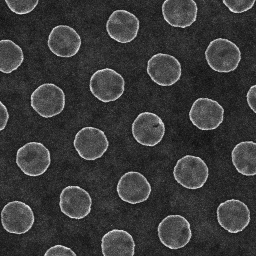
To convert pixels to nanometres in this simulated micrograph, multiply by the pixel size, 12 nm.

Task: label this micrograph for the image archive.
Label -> a regular array of raised bodies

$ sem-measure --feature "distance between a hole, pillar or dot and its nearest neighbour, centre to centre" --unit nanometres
719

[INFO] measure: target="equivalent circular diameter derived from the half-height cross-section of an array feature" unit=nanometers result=392